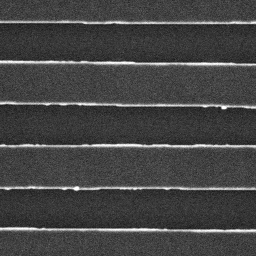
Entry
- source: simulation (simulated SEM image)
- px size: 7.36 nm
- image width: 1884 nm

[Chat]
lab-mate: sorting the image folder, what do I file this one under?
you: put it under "lines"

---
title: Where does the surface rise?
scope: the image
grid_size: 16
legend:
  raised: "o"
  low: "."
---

oooooooooooooooo
................
................
................
oooooooooooooooo
oooooooooooooooo
..oooooooooooooo
................
................
oooooooooooooooo
oooooooooooooooo
oooooooooooooooo
................
................
oooooooooooooooo
oooooooooooooooo